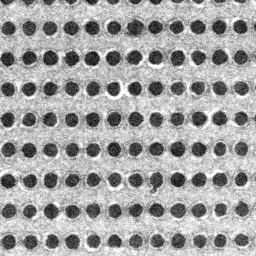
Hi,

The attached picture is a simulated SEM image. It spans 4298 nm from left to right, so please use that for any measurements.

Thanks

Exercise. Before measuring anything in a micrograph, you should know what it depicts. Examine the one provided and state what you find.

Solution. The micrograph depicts a regular array of raised bodies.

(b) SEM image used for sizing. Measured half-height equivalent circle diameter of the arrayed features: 0.271 micrometres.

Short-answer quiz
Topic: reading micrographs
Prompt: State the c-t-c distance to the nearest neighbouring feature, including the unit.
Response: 352 nm